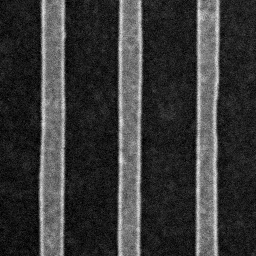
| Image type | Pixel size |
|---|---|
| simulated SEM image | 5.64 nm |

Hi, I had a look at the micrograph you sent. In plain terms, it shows one or a few lines or trenches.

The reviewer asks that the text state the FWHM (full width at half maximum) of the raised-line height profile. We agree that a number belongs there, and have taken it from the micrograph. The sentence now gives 109 nm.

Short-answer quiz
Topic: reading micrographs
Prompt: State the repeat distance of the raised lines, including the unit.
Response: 436 nm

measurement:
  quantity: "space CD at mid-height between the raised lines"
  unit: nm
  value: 329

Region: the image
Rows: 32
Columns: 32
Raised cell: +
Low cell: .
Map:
.....+++.......++........++.....
.....+++.......++........++.....
.....+++.......+++.......++.....
.....+++.......+++.......++.....
.....+++.......+++.......++.....
.....+++.......+++.......++.....
.....+++.......+++.......++.....
.....+++.......+++.......++.....
.....+++.......+++.......++.....
.....+++.......+++.......++.....
.....+++.......++........++.....
.....+++.......++........++.....
.....+++.......++........++.....
.....+++.......++........++.....
.....+++.......++........++.....
.....+++.......++........++.....
.....+++.......++........++.....
.....+++.......++........++.....
.....+++.......++........++.....
.....+++.......++........++.....
.....+++.......++........++.....
.....+++.......++........++.....
.....+++.......++........++.....
.....+++.......++........++.....
.....+++.......++........++.....
.....+++.......++........++.....
.....+++.......++........++.....
.....+++.......++........++.....
.....+++.......++........++.....
.....+++.......++........++.....
.....+++.......++........++.....
.....+++.......++........++.....